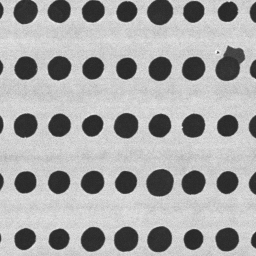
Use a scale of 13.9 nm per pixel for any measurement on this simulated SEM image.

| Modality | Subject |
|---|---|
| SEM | a regular array of holes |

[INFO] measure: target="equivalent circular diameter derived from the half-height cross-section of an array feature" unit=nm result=326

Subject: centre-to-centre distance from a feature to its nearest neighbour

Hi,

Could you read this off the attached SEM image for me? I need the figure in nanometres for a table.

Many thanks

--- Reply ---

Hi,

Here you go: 466